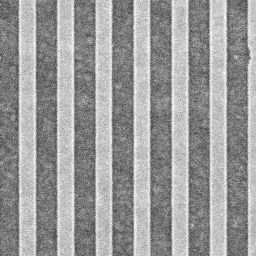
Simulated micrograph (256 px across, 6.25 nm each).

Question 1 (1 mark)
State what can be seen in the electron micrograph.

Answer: parallel lines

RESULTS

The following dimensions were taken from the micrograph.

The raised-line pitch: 0.238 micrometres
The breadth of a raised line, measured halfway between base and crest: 93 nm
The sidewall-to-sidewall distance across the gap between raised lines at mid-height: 147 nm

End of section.